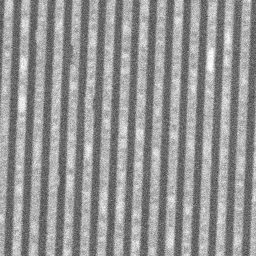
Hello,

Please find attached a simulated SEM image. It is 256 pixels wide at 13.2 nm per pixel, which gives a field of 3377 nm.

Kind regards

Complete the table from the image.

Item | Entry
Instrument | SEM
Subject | parallel lines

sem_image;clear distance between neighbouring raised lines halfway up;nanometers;125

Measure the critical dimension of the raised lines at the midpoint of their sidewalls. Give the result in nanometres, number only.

102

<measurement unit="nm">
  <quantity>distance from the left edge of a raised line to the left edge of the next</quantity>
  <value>224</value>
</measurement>